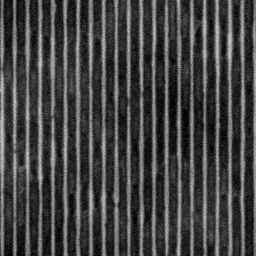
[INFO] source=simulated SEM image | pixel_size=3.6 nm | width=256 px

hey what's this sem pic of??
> parallel lines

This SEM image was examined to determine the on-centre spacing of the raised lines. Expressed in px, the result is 12.7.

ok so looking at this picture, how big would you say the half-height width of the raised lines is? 9.5 nanometers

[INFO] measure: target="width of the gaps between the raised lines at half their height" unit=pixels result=9.89